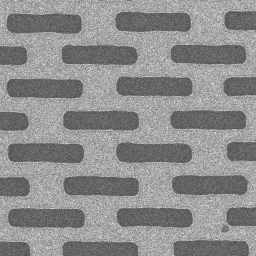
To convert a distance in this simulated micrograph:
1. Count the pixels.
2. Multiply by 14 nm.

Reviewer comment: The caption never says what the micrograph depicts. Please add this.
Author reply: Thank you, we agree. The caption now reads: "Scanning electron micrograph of a regular array of holes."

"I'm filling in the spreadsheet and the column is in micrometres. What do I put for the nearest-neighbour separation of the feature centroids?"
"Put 0.884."